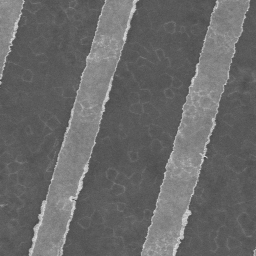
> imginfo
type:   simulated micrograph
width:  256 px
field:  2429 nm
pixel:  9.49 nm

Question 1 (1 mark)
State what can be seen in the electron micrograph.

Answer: one or a few lines or trenches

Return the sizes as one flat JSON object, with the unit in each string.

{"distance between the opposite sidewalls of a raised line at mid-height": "297 nanometers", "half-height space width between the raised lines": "726 nanometres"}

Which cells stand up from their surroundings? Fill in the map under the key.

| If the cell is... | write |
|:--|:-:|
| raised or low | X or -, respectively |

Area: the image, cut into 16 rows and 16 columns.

X-----XX-----XX-
X-----XX-----XX-
X-----XX-----XX-
------XX-----XX-
-----XX-----XX--
-----XX-----XX--
-----XX-----XX--
----XX-----XX---
----XX-----XX---
----XX-----XX---
---XX-----XXX---
---XX-----XX----
---XX-----XX----
--XXX-----XX----
--XX-----XXX----
--XX-----XX-----